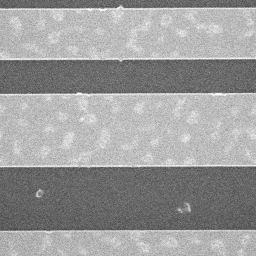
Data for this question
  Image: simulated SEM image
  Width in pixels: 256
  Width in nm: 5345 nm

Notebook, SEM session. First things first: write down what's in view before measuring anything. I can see one or a few lines or trenches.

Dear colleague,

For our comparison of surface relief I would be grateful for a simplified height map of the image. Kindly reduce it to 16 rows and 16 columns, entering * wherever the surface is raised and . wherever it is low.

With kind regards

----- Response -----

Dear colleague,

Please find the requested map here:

................
****************
****************
****************
................
................
****************
****************
****************
****************
................
................
................
................
.***************
****************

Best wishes